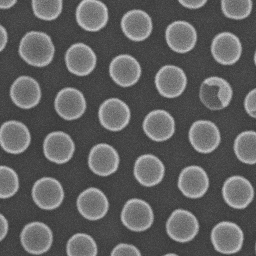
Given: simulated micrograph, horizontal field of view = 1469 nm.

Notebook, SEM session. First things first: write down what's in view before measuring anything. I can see a regular array of raised bodies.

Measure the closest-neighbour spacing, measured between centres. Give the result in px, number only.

45.5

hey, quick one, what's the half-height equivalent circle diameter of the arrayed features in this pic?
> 171 nanometers